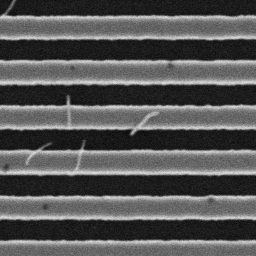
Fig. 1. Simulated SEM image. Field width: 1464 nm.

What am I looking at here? lines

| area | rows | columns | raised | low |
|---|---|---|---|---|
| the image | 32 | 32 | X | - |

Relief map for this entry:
--------------------------------
--------------------------------
XXXXXXXXXXXXXXXXXXXXXXXXXXXXXXXX
XXXXXXXXXXXXXXXXXXXXXXXXXXXXXXXX
XXXXXXXXXXXXXXXXXXXXXXXXXXXXXXXX
--------------------------------
--------------------------------
--------------------------------
XXXXXXXXXXXXXXXXXXXXXXXXXXXXXXXX
XXXXXXXXXXXXXXXXXXXXXXXXXXXXXXXX
XXXXXXXXXXXXXXXXXXXXXXXXXXXXXXXX
--------------------------------
--------------------------------
XXXXXXXXXXXXXXXXXXXXXXXXXXXXXXXX
XXXXXXXXXXXXXXXXXXXXXXXXXXXXXXXX
XXXXXXXXXXXXXXXXXXXXXXXXXXXXXXXX
--------------------------------
--------------------------------
--------------------------------
XXXXXXXXXXXXXXXXXXXXXXXXXXXXXXXX
XXXXXXXXXXXXXXXXXXXXXXXXXXXXXXXX
XXXXXXXXXXXXXXXXXXXXXXXXXXXXXXXX
--------------------------------
--------------------------------
--------------------------X-----
XXXXXXXXXXXXXXXXXXXXXXXXXXXXXXXX
XXXXXXXXXXXXXXXXXXXXXXXXXXXXXXXX
--------------------------------
--------------------------------
--------------------------------
XXXXXXXXXXXXXXXXXXXXXXXXXXXXXXXX
XXXXXXXXXXXXXXXXXXXXXXXXXXXXXXXX